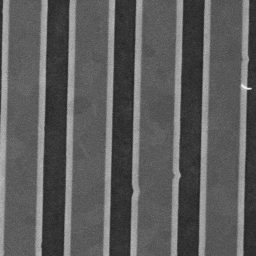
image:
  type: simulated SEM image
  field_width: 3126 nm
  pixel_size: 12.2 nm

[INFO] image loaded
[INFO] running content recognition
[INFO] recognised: one or a few lines or trenches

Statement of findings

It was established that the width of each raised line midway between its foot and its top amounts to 0.493 micrometres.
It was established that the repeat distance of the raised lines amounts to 820 nanometres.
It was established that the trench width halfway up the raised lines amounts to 0.319 microns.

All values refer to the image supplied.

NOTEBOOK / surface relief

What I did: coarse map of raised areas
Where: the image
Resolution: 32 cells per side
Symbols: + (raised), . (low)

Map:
.+++++...+++++...++++++...+++++.
.+++++...+++++...++++++...+++++.
.+++++...+++++...+++++....+++++.
.+++++...+++++...+++++....+++++.
.++++....+++++...+++++....+++++.
.++++....+++++...+++++....+++++.
.++++....+++++...+++++....+++++.
.++++....+++++...+++++....+++++.
.++++....+++++...+++++....+++++.
.++++....+++++...+++++....+++++.
.++++....+++++...+++++....+++++.
+++++....+++++...+++++....+++++.
+++++....+++++...+++++....++++..
+++++....+++++...+++++....++++..
+++++....+++++...+++++....++++..
+++++....+++++...+++++....++++..
+++++....+++++...+++++....++++..
+++++....+++++...+++++....++++..
+++++....+++++...+++++...+++++..
+++++....+++++...+++++...+++++..
+++++....+++++...+++++...+++++..
+++++....+++++...+++++...+++++..
+++++....++++....+++++...+++++..
+++++....++++....+++++...+++++..
+++++...+++++....+++++...+++++..
+++++...+++++....+++++...+++++..
+++++...+++++....+++++...+++++..
+++++...+++++....+++++...+++++..
+++++...+++++....+++++...+++++..
+++++...+++++....+++++...+++++..
+++++...+++++....+++++...+++++..
+++++...+++++....+++++...+++++..